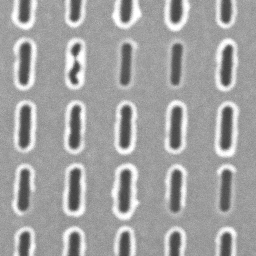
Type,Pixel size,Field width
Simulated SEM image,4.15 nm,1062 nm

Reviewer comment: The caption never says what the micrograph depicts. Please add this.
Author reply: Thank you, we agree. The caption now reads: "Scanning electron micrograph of a regular array of holes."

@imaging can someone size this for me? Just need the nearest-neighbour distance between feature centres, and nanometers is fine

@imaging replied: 209